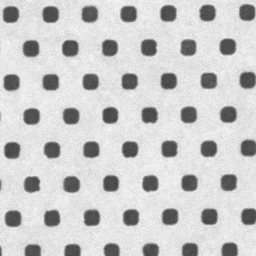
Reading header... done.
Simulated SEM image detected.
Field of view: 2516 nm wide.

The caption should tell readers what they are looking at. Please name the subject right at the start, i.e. a regular array of holes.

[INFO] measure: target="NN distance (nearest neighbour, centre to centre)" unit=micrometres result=0.381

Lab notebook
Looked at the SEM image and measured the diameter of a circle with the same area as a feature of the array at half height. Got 172 nm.